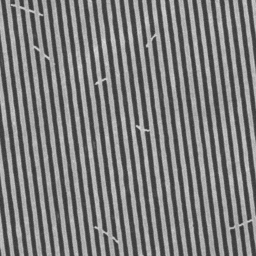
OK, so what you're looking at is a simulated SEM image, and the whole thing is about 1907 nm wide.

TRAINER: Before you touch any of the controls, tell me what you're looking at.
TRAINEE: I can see parallel lines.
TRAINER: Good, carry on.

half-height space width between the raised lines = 33.2 nm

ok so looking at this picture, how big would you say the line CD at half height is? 32.3 nm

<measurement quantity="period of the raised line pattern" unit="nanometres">67.3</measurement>